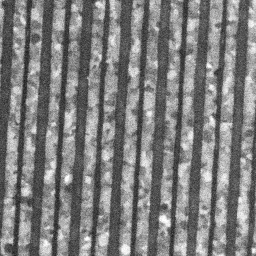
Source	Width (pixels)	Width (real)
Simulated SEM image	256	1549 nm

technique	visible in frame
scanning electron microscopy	parallel lines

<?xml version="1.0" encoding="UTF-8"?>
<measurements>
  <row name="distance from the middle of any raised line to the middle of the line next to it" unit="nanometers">117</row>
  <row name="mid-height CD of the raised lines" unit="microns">0.0672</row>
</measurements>